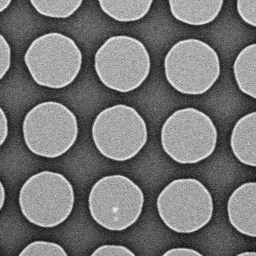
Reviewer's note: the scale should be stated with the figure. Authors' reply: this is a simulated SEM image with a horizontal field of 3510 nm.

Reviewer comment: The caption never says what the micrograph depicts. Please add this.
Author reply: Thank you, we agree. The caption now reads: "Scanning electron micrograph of an array of small figures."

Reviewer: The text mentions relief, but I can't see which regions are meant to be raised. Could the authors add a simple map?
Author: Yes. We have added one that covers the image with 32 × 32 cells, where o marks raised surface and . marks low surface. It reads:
o...oooooo...oooooo..ooooooo..oo
.....oooo....ooooo....ooooo...oo
...............oo......ooo.....o
................................
.....ooo........................
o...ooooo....ooooo....oooo......
o..ooooooo..oooooo...oooooo...oo
o..ooooooo..ooooooo..oooooo...oo
o...oooooo..ooooooo..oooooo..ooo
....ooooo...oooooo...oooooo..ooo
.....ooo.....oooo....oooooo...oo
.......................oo......o
................................
....oooo......oo................
o..oooooo...ooooo....ooooo.....o
o..ooooooo..oooooo...oooooo...oo
o..ooooooo..oooooo..ooooooo..ooo
...oooooo...oooooo..ooooooo..ooo
....ooooo...oooooo...oooooo..ooo
......o......oooo....ooooo....oo
...............................o
................................
....oooo.....ooo......oo........
...oooooo...ooooo....ooooo....oo
..ooooooo..ooooooo..oooooo...ooo
...oooooo..ooooooo..oooooo...ooo
...oooooo..ooooooo..ooooooo..ooo
....oooo....ooooo...oooooo...ooo
.............ooo.....oooo.....oo
................................
....ooo.........................
...ooooo....oooo.....ooo........